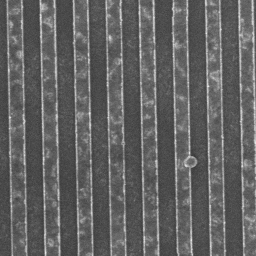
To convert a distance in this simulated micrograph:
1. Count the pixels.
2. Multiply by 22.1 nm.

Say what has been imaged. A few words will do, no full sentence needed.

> parallel lines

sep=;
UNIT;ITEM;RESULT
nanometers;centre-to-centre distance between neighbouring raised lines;729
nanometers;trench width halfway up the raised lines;400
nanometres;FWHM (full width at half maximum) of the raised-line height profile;334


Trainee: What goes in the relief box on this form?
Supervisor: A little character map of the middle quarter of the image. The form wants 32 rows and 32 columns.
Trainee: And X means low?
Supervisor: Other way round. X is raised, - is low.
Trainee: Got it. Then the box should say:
---XXX-----XXX-----XXXX-----XXX-
---XXX-----XXX-----XXXX-----XXX-
---XXX-----XXXX----XXXX-----XXX-
---XXX-----XXXX----XXXX-----XXX-
---XXX-----XXXX----XXXX-----XXX-
---XXX-----XXXX----XXXX-----XXX-
---XXX-----XXXX----XXXX-----XXX-
---XXX-----XXXX----XXXX-----XXX-
---XXX-----XXXX----XXXX-----XXX-
---XXX-----XXXX----XXXX-----XXX-
---XXX-----XXXX----XXXX-----XXX-
---XXX-----XXXX----XXXX-----XXX-
---XXX-----XXXX----XXXX-----XXX-
---XXXX----XXXX----XXXX-----XXX-
---XXX-----XXXX----XXXX-----XXX-
---XXXX----XXXX-----XXX-----XXX-
---XXX-----XXXX-----XXX-----XXX-
---XXXX----XXXX----XXXX-----XXX-
---XXXX----XXXX-----XXX-----XXX-
---XXXX----XXXX-----XXX-----XXX-
---XXXX----XXXX-----XXX-----XXX-
---XXXX----XXXX-----XXX-----XXX-
---XXXX----XXXX-----XXX-----XXX-
---XXXX----XXXX-----XXX-----XXXX
---XXXX----XXXX-----XXX-----XXXX
---XXXX----XXXX-----XXX-----XXXX
---XXXX----XXXX-----XXX-----XXX-
---XXXX----XXXX-----XXX-----XXX-
---XXXX----XXXX-----XXX-----XXX-
---XXXX-----XXX-----XXX-----XXX-
---XXXX----XXXX-----XXX-----XXX-
---XXXX-----XXX-----XXX-----XXXX